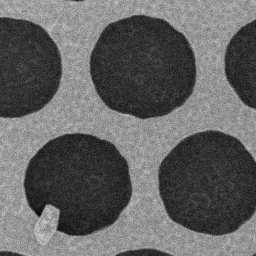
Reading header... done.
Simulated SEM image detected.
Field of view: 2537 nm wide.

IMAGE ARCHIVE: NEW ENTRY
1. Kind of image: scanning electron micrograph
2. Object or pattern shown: holes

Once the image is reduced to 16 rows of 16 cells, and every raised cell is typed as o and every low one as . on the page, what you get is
oooooooooooooooo
..ooooo....oooo.
...ooo......oo..
....oo......oo..
....oo......oo..
....oo......ooo.
...oooo....oooo.
oooooooooooooooo
oooo..oooooo...o
oo.....oooo.....
oo......oo......
oo......oo......
oo......oo......
oooo...oooo.....
oooo..oooooo...o
oooooooooooooooo